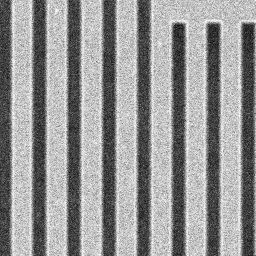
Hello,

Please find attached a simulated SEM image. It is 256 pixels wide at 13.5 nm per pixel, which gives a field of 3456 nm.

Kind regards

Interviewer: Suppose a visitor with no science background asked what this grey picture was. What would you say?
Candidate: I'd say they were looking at parallel lines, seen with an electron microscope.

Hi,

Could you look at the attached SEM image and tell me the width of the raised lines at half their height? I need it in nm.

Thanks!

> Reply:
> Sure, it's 295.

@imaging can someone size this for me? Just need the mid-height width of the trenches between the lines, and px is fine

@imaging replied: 13.1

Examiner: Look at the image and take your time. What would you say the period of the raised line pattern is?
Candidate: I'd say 34.8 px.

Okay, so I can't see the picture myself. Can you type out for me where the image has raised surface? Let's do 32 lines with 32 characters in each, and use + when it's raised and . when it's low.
.+++..++..+++..++..+++++++++++++
.+++..++..+++..++..+++++++++++++
.+++..++..+++..++..+++++++++++++
.+++..++..+++..++..++..+++..++..
.+++..++..+++.+++..++..+++..++..
.+++..++..+++.+++..++..+++..++..
.+++..++..+++..++..++..+++..++..
.+++..++..+++..++..++..+++..++..
.+++..++..+++..++..++..+++..++..
.+++..++..+++..++..++..+++..++..
.+++..++..+++.+++..++..+++..++..
.+++..++..+++.+++..++..+++..++..
.+++..++..+++..++..++..+++..++..
.+++..++..+++..++..++..+++..++..
.+++..++..+++..++..++..+++..++..
.+++..++..+++..++..++..+++..++..
.+++..++..+++..++..++..+++..++..
.+++..++..+++..++..++..+++..++..
.+++..++..+++..++..++..+++..++..
.+++..++..+++..++..++..+++..++..
.+++..++..+++..++..++..+++..++..
.+++..++..+++..++..++..+++..++..
.+++..++..+++..++..++..+++..++..
.+++..++..+++..++..++..+++..++..
.+++..++..+++..++..++..+++..++..
.+++..++..+++..++..++..+++..++..
.+++..++..+++..++..++..+++..++..
.+++..++..+++..++..++..+++..++..
.+++..++..+++..++..++..+++..++..
.+++..++..+++..++..++..+++..++..
.+++..++..+++..++..++..+++..++..
.+++..++..+++..++..++..+++..++..